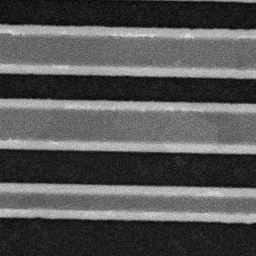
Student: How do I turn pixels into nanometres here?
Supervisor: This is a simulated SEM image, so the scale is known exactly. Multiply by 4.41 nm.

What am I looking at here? one or a few lines or trenches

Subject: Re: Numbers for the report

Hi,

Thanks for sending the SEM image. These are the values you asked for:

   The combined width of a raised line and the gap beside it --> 75.6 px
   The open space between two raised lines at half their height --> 172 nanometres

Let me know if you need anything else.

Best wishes